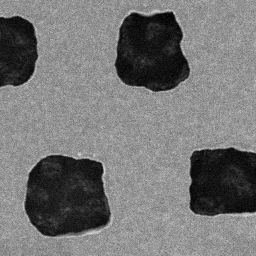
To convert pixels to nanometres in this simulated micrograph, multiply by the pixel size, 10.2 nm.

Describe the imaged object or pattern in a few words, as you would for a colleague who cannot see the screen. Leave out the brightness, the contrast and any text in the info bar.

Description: holes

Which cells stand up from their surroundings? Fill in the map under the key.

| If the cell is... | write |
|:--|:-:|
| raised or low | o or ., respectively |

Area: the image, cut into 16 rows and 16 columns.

oooooooooooooooo
..oooooo...ooooo
..ooooo....ooooo
..ooooo.....oooo
..ooooo.....oooo
ooooooooo..ooooo
oooooooooooooooo
oooooooooooooooo
oooooooooooooooo
oooooooooooo....
oo....oooooo....
oo....oooooo....
oo.....ooooo....
oo.....ooooooooo
oo...ooooooooooo
oooooooooooooooo